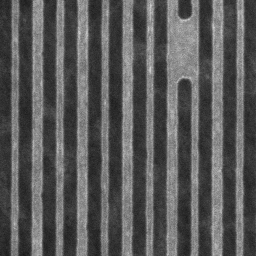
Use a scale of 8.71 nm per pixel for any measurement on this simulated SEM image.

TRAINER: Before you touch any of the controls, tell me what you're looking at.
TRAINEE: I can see parallel lines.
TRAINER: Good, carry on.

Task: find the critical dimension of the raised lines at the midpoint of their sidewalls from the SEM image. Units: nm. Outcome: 144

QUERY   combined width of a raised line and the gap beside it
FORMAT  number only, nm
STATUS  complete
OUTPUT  198